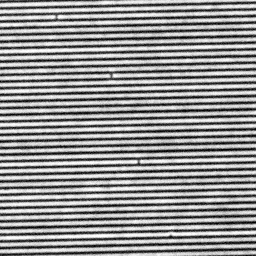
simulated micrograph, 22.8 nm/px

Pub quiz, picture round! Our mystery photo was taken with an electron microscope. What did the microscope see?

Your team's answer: parallel lines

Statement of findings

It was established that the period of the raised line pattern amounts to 152 nm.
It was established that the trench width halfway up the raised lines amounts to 85.5 nanometers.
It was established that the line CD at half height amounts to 62.7 nanometres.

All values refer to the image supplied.